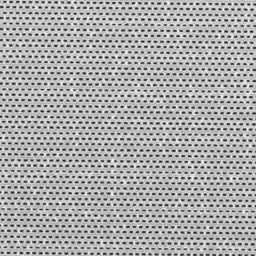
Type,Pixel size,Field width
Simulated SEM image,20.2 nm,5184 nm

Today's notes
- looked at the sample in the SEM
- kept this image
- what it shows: a regular array of holes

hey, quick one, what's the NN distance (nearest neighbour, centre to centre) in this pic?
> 120 nanometers